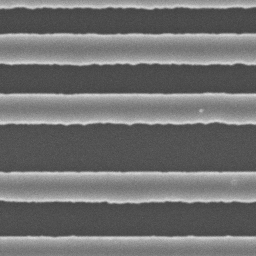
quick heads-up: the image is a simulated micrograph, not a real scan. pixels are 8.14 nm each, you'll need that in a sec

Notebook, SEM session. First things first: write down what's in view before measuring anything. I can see lines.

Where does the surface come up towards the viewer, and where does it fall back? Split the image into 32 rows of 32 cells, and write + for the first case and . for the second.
++++++++++++++++++++++++++++++++
................................
................................
................................
++++++++++++++++++++++++++++++++
++++++++++++++++++++++++++++++++
++++++++++++++++++++++++++++++++
++++++++++++++++++++++++++++++++
................................
................................
................................
................................
++++++++++++++++++++++++++++++++
++++++++++++++++++++++++++++++++
++++++++++++++++++++++++++++++++
........+.+.....................
................................
................................
................................
................................
................................
................................
++++++++++++++++++++++++++++++++
++++++++++++++++++++++++++++++++
++++++++++++++++++++++++++++++++
................................
................................
................................
................................
................................
++++++++++++++++++++++++++++++++
++++++++++++++++++++++++++++++++